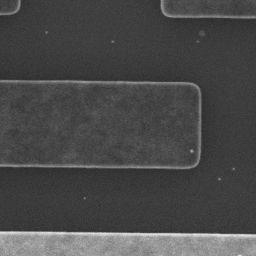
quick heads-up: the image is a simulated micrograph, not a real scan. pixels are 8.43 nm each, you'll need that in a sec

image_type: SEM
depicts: wiring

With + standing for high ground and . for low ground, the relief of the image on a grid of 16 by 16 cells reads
+.........++++++
................
................
................
................
++++++++++++....
+++++++++++++...
+++++++++++++...
+++++++++++++...
+++++++++++++...
..........++....
................
................
................
................
++++++++++++++++